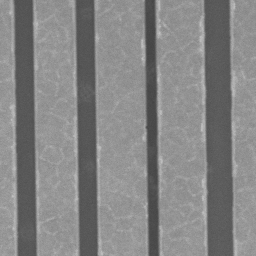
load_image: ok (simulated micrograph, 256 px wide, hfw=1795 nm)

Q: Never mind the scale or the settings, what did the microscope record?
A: one or a few lines or trenches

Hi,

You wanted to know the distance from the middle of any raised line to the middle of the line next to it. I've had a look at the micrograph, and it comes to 439 nanometers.